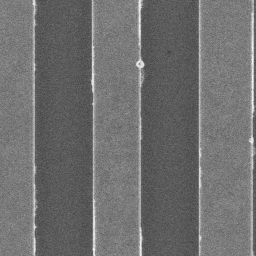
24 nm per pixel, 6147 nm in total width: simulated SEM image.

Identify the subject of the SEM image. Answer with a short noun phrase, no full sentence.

lines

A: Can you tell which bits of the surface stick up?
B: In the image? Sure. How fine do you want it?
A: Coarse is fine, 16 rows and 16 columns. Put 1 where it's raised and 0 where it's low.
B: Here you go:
1100001110001111
1100001110001111
1100001110001111
1100001110001111
1100001110001111
1100001110001111
1100001110001111
1100001110001111
1100001110001111
1100001110001111
1100001110001111
1100001110001111
1100001110001111
1100001110001111
1100001110001111
1100001110001111